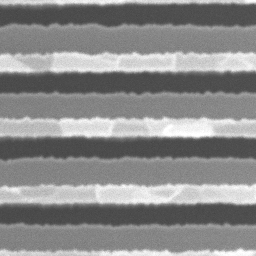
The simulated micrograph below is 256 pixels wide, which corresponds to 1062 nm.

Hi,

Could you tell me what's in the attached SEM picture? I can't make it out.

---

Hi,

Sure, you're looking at lines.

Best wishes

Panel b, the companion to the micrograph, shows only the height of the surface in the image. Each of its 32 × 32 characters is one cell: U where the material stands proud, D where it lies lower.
UUUUUUUUUUUUUUUDDDDDDDDDDDDDDDDD
DDDDDDDDDDDDDDDDDDDDDDDDDDDDDDDD
DDDDDDDDDDDDDDDDDDDDDDDDDDDDDDDD
UUUUUUUUUUUUUUUUUUUUUUUUUUUUUUUU
UUUUUUUUUUUUUUUUUUUUUUUUUUUUUUUU
UUUUUUUUUUUUUUUUUUUUUUUUUUUUUUUU
UUUUUUUUUUUUUUUUUUUUUUUUUUUUUUUU
UUUUUUUUUUUUUUUUUUUUUUUUUUUUUUUU
UUUUUUUUUUUUUUUUUUUUUUUUUUUUUUUU
DDDDDDDDDDDDDDDDDDDDDDDDDDDDDDDD
DDDDDDDDDDDDDDDDDDDDDDDDDDDDDDDD
DDDDDDDDDDDDDDDDDDDDDDDDDDDDDDDD
UUUUUUUUUUUUUUUUUUUUUUUUUUUUUUUU
UUUUUUUUUUUUUUUUUUUUUUUUUUUUUUUU
UUUUUUUUUUUUUUUUUUUUUUUUUUUUUUUU
UUUUUUUUUUUUUUUUUUUUUUUUUUUUUUUU
UUUUUUUUUUUUUUUUUUUUUUUUUUUUUUUU
DDDDDDDDDDDDDDDDDDDDDDDDDDDDDDDD
DDDDDDDDDDDDDDDDDDDDDDDDDDDDDDDD
DDDDDDDDDDDDDDDDDDDDDDDDDDDDDDDD
UUUUUUUUUUUUUUUUUUUUUUUUUUUUUUUU
UUUUUUUUUUUUUUUUUUUUUUUUUUUUUUUU
UUUUUUUUUUUUUUUUUUUUUUUUUUUUUUUU
UUUUUUUUUUUUUUUUUUUUUUUUUUUUUUUU
UUUUUUUUUUUUUUUUUUUUUUUUUUUUUUUU
UUUUUUUUUUUUUUUUUUUUUUUUUDDDDUUU
DDDDDDDDDDDDDDDDDDDDDDDDDDDDDDDD
DDDDDDDDDDDDDDDDDDDDDDDDDDDDDDDD
UUUUUUUUUUUUUUUUUUUUUUUUUUUUUUUU
UUUUUUUUUUUUUUUUUUUUUUUUUUUUUUUU
UUUUUUUUUUUUUUUUUUUUUUUUUUUUUUUU
UUUUUUUUUUUUUUUUUUUUUUUUUUUUUUUU